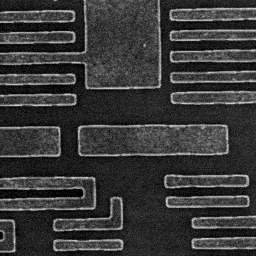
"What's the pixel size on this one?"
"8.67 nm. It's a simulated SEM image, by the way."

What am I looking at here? wiring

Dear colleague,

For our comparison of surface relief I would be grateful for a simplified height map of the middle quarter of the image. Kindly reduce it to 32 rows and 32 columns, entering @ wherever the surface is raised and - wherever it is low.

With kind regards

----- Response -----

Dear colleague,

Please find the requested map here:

-----@@@@@@@@@@@@@@@@@@@--------
------@@@@@@@@@@@@@@@@@@--------
------@@@@@@@@@@@@@@@@@@---@@@@@
@@@---@@@@@@@@@@@@@@@@@@---@@@@@
@@----@@@@@@@@@@@@@@@@@@--------
------@@@@@@@@@@@@@@@@@@--------
--------------------------------
---------------------------@@@@@
@@@------------------------@@@@@
@@@------------------------@@@@@
--------------------------------
--------------------------------
--------------------------------
--------------------------------
--------------------------------
--------------------@@@@@@-----@
----@@@@@@@@@@@@@@@@@@@@@@@@@@@@
----@@@@@@@@@@@@@@@@@@@@@@@@@@@@
----@@@@@@@@@@@@@@@@@@@@@@@@@@@@
----@@@@@@@@@@@@@@@@@@@@@@@@@@@@
----@@@@@@@@@@@@@@@@@@@@@@@@@@@@
----@@@@@@@@@@@@@@@@@@@@@@@@@@@@
----@@@@@@@@@@@@@@@@@@@@@@@@----
--------------------------------
--------------------------------
--------------------------------
--------------------------------
--------------------------------
@------------------------@@@@@@@
@@@@@@@@-----------------@@@@@@@
@@@@@@@@-----------------@@@@@@@
-----@@@------------------------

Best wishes